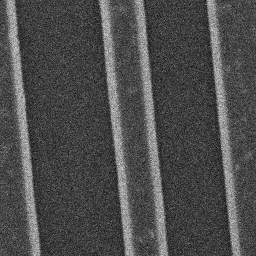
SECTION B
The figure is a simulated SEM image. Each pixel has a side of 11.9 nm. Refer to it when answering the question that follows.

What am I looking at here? one or a few lines or trenches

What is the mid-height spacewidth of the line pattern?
978 nm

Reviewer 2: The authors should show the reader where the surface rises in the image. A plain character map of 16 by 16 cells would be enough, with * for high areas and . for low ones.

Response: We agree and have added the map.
*......**....***
*......**....***
*......**....***
*......**.....**
*......**.....**
*......**.....**
*......**.....**
*......**.....**
**.....**.....**
**.....***....**
**......**....**
**......**....**
**......**....**
**......**.....*
**......**.....*
**......**.....*